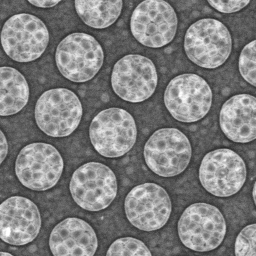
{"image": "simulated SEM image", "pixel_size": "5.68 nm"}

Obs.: a regular array of raised bodies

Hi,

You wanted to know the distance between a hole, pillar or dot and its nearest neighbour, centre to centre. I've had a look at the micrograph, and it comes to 327 nanometres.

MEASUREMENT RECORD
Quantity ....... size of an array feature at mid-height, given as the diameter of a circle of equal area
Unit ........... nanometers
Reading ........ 266